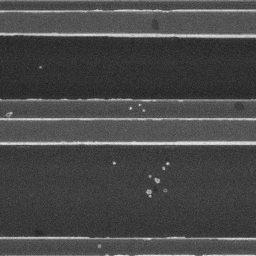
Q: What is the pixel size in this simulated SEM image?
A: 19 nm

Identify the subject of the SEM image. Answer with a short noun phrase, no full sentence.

lines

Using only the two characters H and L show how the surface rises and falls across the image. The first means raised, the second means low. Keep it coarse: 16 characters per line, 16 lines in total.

HHHHHHHHHHHHHHHH
HHHHHHHHHHHHHHHH
LLLLLLLLLLLLLLLL
LLLLLLLLLLLLLLLL
LLLLLLLLLLLLLLLL
LLLLLLLLLLLLLLLL
HHHHHHHHHHHHHHHH
HHHHHHHHHHHHHHHH
HHHHHHHHHHHHHHHH
LLLLLLLLLLLLLLLL
LLLLLLLLLLLLLLLL
LLLLLLLLLLLLLLLL
LLLLLLLLLLLLLLLL
LLLLLLLLLLLLLLLL
LLLLLLLLLLLLLLLL
HHHHHHHHHHHHHHHH